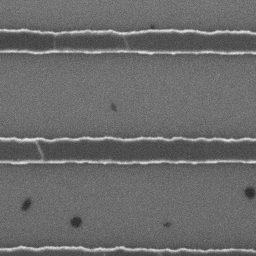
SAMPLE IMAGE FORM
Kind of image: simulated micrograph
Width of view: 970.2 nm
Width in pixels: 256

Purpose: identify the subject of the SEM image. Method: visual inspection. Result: lines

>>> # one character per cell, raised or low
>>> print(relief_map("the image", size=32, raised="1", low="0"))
00000000000000000000000000000000
00000000000000000000000000000000
00000000000000000000000000000000
00000000000000000000000000000000
11111111111111111111111111111111
11111111111111111111111111111111
00011100001110000111111111111111
00000000000000000000000000000000
00000000000000000000000000000000
00000000000000000000000000000000
00000000000000000000000000000000
00000000000000000000000000000000
00000000000000000000000000000000
00000000000000000000000000000000
00000000000000000000000000000000
00000000000000000000000000000000
00000000000000000000000000000000
11111101111111111111111111111111
11111111111111111111111111111111
11111111111111111111111111111111
00000000000000000000000000000000
00000000000000000000000000000000
00000000000000000000000000000000
00000000000000000000000000000000
00000000000000000000000000000000
00000000000000000000000000000000
00000000000000000000000000000000
00000000000000000000000000000000
00000000000000000000000000000000
00000000000000000000000000000000
00000000000000000000000000000000
11111111111111111111111111111111